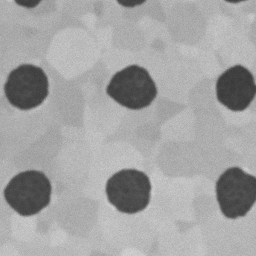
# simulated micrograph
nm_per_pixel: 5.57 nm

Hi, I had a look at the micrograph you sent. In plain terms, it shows holes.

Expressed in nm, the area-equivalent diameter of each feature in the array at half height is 256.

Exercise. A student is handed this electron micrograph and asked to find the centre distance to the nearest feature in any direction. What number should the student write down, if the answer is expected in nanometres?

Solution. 568